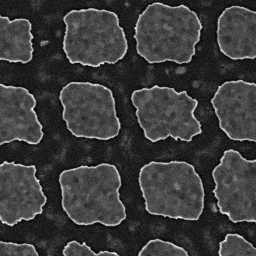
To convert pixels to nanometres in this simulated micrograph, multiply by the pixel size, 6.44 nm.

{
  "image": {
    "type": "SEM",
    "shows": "raised bodies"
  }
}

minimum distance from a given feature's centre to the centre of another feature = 482 nanometres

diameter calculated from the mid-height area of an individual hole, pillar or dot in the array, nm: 400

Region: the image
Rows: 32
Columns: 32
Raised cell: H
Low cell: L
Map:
LLLLLLLLLLLLLLLLLLLHLLLLLLLLLLLL
LLLLLLLLLHHHHHLLLLHHHHHHLLLLHHHH
HLHLLLLLHHHHHHHLLHHHHHHHHLLHHHHH
HHHHLLLLHHHHHHHLLHHHHHHHHLLHHHHH
HHHHLLLLHHHHHHHHLHHHHHHHHLLHHHHH
HHHHLLLLHHHHHHHHLHHHHHHHHLLHHHHH
HHHHLLLLHHHHHHHHLHHHHHHHLLLLHHHH
HHHHLLLLLHHHHHHLLLHHHHHHLLLLLLLL
LLLLLLLLLLLLLLLLLLLLLLLLLLLLLLLL
LLLLLLLLLLLLLLLLLLLLLLLLLLLLLLLL
LLLLLLLLLHHLLLLLLLLLLLLLLLLLHHHH
HHHHLLLLHHHHHHLLLHHHHHLLLLLHHHHH
HHHHLLLLHHHHHHLLLHHHHHHHLLLHHHHH
HHHHLLLLHHHHHHLLLHHHHHHHLLLHHHHH
HHHHHLLLHHHHHHHLLHHHHHHHLLLHHHHH
HHHHHLLLHHHHHHHLLHHHHHHHHLLHHHHH
HHHHHLLLLHHHHHHLLLHHHHHHHLLLHHHH
HHLHHLLLLLLLLLLLLLLHLLLLLLLLLLLH
LLLLLLLLLLLLLLLLLLLLLLLLLLLLLLLL
LLLLLLLLLLLLLLLLLLLLLLLLLLLLHHLL
HHLLLLLLLLLLLLLLLLLHHHHHLLLHHHHH
HHHHLLLLHHHHHHHLLLHHHHHHLLLHHHHH
HHHHHLLLHHHHHHHLLHHHHHHHHLLHHHHH
HHHHHLLLHHHHHHHLLLHHHHHHHLLHHHHH
HHHHHHLLHHHHHHHLLLHHHHHHHLLHHHHH
HHHHHHLLHHHHHHHLLLHHHHHHHLLHHHHH
HHHHHLLLHHHHHHHHLLLHHHHHHLLLHHHH
HHHLLLLLLHHHHHHLLLLLLLLLLLLLLHHH
LLLLLLLLLLLLLLLLLLLLLLLLLLLLLLLL
LLLLLLLLLLLLLLLLLLLLLLLLLLLLHHLL
HHLLLLLLLHLLLLLLLLHHHHLLLLLLHHHL
HHHHHLLLHHHHLHLLLLHHHHHLLLLHHHHH